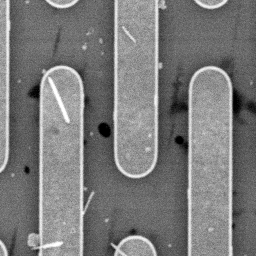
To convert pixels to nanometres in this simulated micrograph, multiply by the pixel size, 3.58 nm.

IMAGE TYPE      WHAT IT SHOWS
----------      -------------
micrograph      groups of lines, slits or small figures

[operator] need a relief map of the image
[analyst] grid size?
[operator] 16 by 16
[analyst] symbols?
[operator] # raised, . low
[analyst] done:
.......###......
.......###......
.......###......
.......###......
...##..###..##..
...##..###..##..
...##..###..##..
...##..###..##..
...##..###..##..
...##..###..##..
...##...#...##..
...##.......##..
...##.......##..
...##.......##..
...##.......##..
..###..###..##..